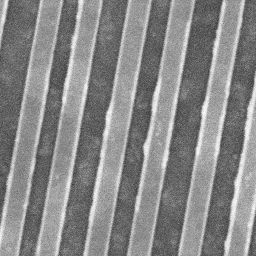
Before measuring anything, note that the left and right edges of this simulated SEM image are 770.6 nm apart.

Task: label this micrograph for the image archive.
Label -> parallel lines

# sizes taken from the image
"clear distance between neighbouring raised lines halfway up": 0.07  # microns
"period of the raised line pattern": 136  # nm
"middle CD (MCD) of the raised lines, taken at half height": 64.9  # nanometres